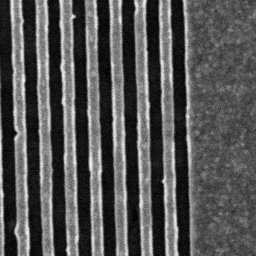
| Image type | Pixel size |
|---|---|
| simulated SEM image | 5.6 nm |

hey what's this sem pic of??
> parallel lines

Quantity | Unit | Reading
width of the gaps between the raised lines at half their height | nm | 75.5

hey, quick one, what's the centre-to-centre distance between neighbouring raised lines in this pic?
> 0.138 µm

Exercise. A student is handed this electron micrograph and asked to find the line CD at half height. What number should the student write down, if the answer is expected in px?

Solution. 11.1